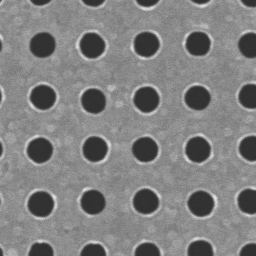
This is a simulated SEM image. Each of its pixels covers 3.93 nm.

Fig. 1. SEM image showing a regular array of holes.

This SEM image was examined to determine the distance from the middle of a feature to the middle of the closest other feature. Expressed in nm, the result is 202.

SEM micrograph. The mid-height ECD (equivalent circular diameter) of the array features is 100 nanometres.